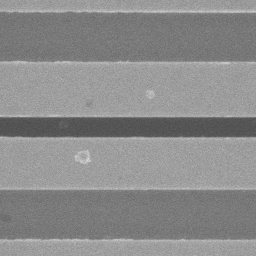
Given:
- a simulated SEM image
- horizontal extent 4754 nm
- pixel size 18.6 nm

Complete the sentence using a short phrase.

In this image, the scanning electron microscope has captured lines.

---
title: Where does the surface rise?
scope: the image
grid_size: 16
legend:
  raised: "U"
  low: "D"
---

UUUUUUUUUUUUUUUU
DDDDDDDDDDDDDDDD
DDDDDDDDDDDDDDDD
DDDDDDDDDDDDDDDD
UUUUUUUUUUUUUUUU
UUUUUUUUUUUUUUUU
UUUUUUUUUUUUUUUU
DDDDDDDDDDDDDDDD
DDDDDDDDDDDDDDDD
UUUUUUUUUUUUUUUU
UUUUUUUUUUUUUUUU
UUUUUUUUUUUUUUUU
DDDDDDDDDDDDDDDD
DDDDDDDDDDDDDDDD
DDDDDDDDDDDDDDDD
UUUUUUUUUUUUUUUU